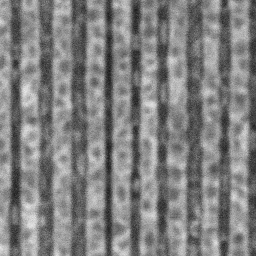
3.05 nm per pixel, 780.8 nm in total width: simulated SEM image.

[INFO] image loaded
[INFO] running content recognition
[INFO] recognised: parallel lines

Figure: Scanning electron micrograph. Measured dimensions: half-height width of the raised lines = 52.6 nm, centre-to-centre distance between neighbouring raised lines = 91.3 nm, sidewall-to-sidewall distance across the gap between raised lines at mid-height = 39.2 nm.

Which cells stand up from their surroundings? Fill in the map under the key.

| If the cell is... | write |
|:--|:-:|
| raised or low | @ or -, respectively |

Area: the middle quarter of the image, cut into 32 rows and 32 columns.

@@----@@@@--@@@@@--@@@@---@@@@--
@@----@@@@--@@@@@--@@@@---@@@@--
@@----@@@@--@@@@@--@@@@---@@@@--
@@----@@@@--@@@@@---@@@---@@@@--
@@----@@@@--@@@@@---@@@---@@@@--
@@----@@@@--@@@@----@@@---@@@@@-
@@----@@@@--@@@@---@@@@---@@@@@-
@@----@@@@--@@@@---@@@@---@@@@@-
@@----@@@@--@@@@---@@@@---@@@@@-
@@----@@@@--@@@@----@@@---@@@@@-
@@----@@@@--@@@@---@@@@---@@@@@-
@@----@@@@--@@@@---@@@@---@@@@@-
@@----@@@@--@@@@---@@@@---@@@@@-
@@----@@@@--@@@@---@@@@---@@@@@-
@@----@@@@--@@@@---@@@@---@@@@@-
@@----@@@@--@@@@---@@@@---@@@@--
@@----@@@@--@@@@----@@@---@@@@--
@@----@@@@--@@@@----@@@---@@@@--
@@----@@@@--@@@@----@@@---@@@@--
@@----@@@@--@@@@----@@@---@@@@--
@@----@@@@--@@@@----@@@---@@@@--
@@----@@@@--@@@@@--@@@@---@@@@--
@@----@@@@--@@@@@--@@@@---@@@@--
@@----@@@@--@@@@---@@@@---@@@@--
@@----@@@@--@@@@---@@@@---@@@@--
@@----@@@@--@@@@---@@@@---@@@@--
@@----@@@@--@@@@---@@@@---@@@@--
@@----@@@@--@@@@---@@@@---@@@@--
@@----@@@@--@@@@----@@@---@@@@--
@@----@@@@--@@@@---@@@@---@@@@--
@@----@@@@--@@@@---@@@@---@@@@--
@-----@@@@--@@@@---@@@@---@@@@--